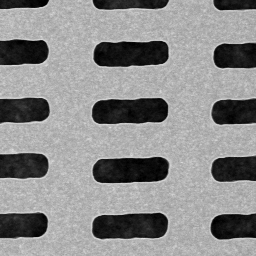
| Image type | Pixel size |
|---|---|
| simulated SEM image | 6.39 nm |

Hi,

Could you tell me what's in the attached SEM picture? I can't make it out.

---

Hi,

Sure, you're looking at holes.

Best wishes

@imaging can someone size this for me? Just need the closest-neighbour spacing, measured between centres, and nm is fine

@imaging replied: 363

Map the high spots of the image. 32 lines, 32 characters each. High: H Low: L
LLLLLLHHHHHHLLLLLLLLLHHHHHHLLLLL
HHHHHHHHHHHHHHHHHHHHHHHHHHHHHHHH
HHHHHHHHHHHHHHHHHHHHHHHHHHHHHHHH
HHHHHHHHHHHHHHHHHHHHHHHHHHHHHHHH
HHHHHHHHHHHHHHHHHHHHHHHHHHHHHHHH
LLLLLLHHHHHHLLLLLLLLLHHHHHHHLLLL
LLLLLLHHHHHHLLLLLLLLLHHHHHHLLLLL
LLLLLLHHHHHHLLLLLLLLLHHHHHHLLLLL
HHHHHHHHHHHHHHHHHHHHHHHHHHHHLLLH
HHHHHHHHHHHHHHHHHHHHHHHHHHHHHHHH
HHHHHHHHHHHHHHHHHHHHHHHHHHHHHHHH
HHHHHHHHHHHHHHHHHHHHHHHHHHHHHHHH
LLLLLLHHHHHHHLLLLLLLHHHHHHHHLLHL
LLLLLLHHHHHHLLLLLLLLLHHHHHHLLLLL
LLLLLLHHHHHHLLLLLLLLLHHHHHLLLLLL
HHHHHHHHHHHHHLHHHHHHHHHHHHHLLLLH
HHHHHHHHHHHHHHHHHHHHHHHHHHHHHHHH
HHHHHHHHHHHHHHHHHHHHHHHHHHHHHHHH
HHHHHHHHHHHHHHHHHHHHHHHHHHHHHHHH
LLLLLHHHHHHHHHHHHHHHHHHHHHHHHHHH
LLLLLLHHHHHHLLLLLLLLLHHHHHHLLLLL
LLLLLLHHHHHHLLLLLLLLLHHHHHLLLLLL
HHHHHHHHHHHHLLLLLLLLHHHHHHHLLLLL
HHHHHHHHHHHHHHHHHHHHHHHHHHHHHHHH
HHHHHHHHHHHHHHHHHHHHHHHHHHHHHHHH
HHHHHHHHHHHHHHHHHHHHHHHHHHHHHHHH
HHHHHHHHHHHHHHHHHHHHHHHHHHHHHHHH
LLLLLLHHHHHHLLLLLLLLLHHHHHHLLLLL
LLLLLLHHHHHLLLLLLLLLLHHHHHLLLLLL
LLLLLHHHHHHHLLLLLLLLHHHHHHHLLLLL
HHHHHHHHHHHHHHHHHHHHHHHHHHHHHHHH
HHHHHHHHHHHHHHHHHHHHHHHHHHHHHHHH